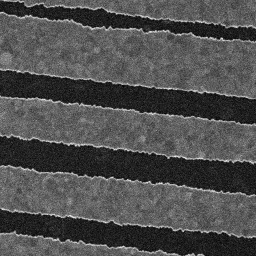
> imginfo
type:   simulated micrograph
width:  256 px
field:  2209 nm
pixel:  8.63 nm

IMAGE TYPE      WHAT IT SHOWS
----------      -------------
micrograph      one or a few lines or trenches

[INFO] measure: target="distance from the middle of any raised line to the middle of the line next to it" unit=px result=72.5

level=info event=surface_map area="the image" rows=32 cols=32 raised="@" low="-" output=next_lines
---@@@@@@@@@@@@@@@@@@@@@@@@@@@@@
--------------@@@@@@@@@@@@@@@@@@
@@@@@@---------------@@@@@@@@@@@
@@@@@@@@@@@@@-------------------
@@@@@@@@@@@@@@@@@@@@@@@@--------
@@@@@@@@@@@@@@@@@@@@@@@@@@@@@@@@
@@@@@@@@@@@@@@@@@@@@@@@@@@@@@@@@
@@@@@@@@@@@@@@@@@@@@@@@@@@@@@@@@
@@@@@@@@@@@@@@@@@@@@@@@@@@@@@@@@
-------@@@@@@@@@@@@@@@@@@@@@@@@@
----------------@@@@@@@@@@@@@@@@
-------------------------@@@@@@@
@@@@@@--------------------------
@@@@@@@@@@@@@@------------------
@@@@@@@@@@@@@@@@@@@@@@----------
@@@@@@@@@@@@@@@@@@@@@@@@@@@@@@--
@@@@@@@@@@@@@@@@@@@@@@@@@@@@@@@@
-----@@@@@@@@@@@@@@@@@@@@@@@@@@@
--------------@@@@@@@@@@@@@@@@@@
---------------------@@@@@@@@@@@
--------------------------------
@@@@@---------------------------
@@@@@@@@@@@@@@@@----------------
@@@@@@@@@@@@@@@@@@@@@@@@--------
@@@@@@@@@@@@@@@@@@@@@@@@@@@@@@@@
@@@@@@@@@@@@@@@@@@@@@@@@@@@@@@@@
---@@@@@@@@@@@@@@@@@@@@@@@@@@@@@
------------@@@@@@@@@@@@@@@@@@@@
---------------------@@@@@@@@@@@
@@@@--------------------------@@
@@@@@@@@@@@---------------------
@@@@@@@@@@@@@@@@@@-@------------